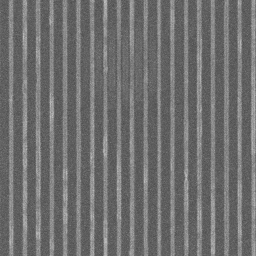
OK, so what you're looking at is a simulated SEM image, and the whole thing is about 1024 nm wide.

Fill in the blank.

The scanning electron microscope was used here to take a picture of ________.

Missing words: parallel lines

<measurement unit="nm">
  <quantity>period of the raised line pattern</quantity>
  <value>53.8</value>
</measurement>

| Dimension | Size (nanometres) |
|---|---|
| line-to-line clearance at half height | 42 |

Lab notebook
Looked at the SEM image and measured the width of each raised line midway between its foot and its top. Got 3.25 pixels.